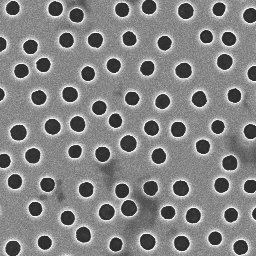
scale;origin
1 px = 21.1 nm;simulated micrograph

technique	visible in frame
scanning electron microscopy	a regular array of holes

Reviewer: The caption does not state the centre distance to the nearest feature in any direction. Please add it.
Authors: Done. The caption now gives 0.571 micrometres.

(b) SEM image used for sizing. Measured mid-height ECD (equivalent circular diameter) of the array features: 310 nanometres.